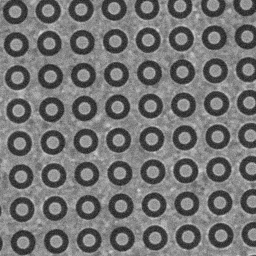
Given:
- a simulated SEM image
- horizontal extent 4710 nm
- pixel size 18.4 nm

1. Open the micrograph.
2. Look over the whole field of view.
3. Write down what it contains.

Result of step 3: an array of small figures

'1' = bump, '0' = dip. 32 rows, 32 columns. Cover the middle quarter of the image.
11100001111000001110000011100000
11000000110000001100110011000000
11000000110000001100111001000000
11000000110000001100010011100000
11000000111000001110000011110000
11100001111100011111101111111111
11111111111111111111111111111111
11111111111111111111100111110000
11100001111000001110000011100000
11000000110001001110000001100110
11000000110011100100000001100110
11000000110011100110000001100100
11000000111000001110000011100000
11100001111100011111000111111001
11111111111111111111111111111111
11111111111111111111101111111000
11110001111100001111000011110000
11100000111000000110000001100000
11000000010000000110000001100000
11000000010000000110000001100000
11100000011000000110000001110000
11100000111000001111000011111000
11111011111111111111111111111111
11111111111111111111111111111101
11111001111100001111000001110000
11100000111000000110000001100000
11100000011000000110000000100000
01000000011000000110000000100000
01100000011000000110000001110000
11100000111100001111000011111000
11110001111110011111111111111111
11111111111111111111111111111111